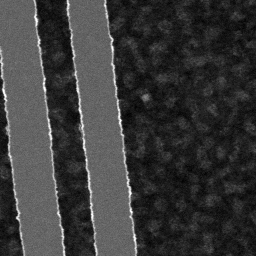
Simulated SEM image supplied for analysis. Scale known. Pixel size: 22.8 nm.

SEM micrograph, one or a few lines or trenches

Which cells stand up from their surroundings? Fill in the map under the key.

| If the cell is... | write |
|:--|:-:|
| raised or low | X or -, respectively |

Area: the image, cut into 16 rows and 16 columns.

--XX---XXXXXXXXX
--XX---XXXXXXXXX
--XXX--XXXXXXXXX
---XX--XXXXXXXXX
---XX--XXXXXXXXX
---XX--XXXXXXXXX
---XX--XXXXXXXXX
---XX--XXXXXXXXX
X--XX---XXXXXXXX
X--XX---XXXXXXXX
X--XX---XXXXXXXX
X--XXX--XXXXXXXX
X---XX--XXXXXXXX
X---XX--XXXXXXXX
X---XX--XXXXXXXX
X---XX--XXXXXXXX